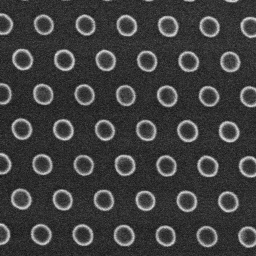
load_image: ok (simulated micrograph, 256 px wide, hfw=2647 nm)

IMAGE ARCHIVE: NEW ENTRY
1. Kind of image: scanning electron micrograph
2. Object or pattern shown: a regular array of raised bodies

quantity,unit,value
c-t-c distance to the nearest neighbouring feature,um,0.418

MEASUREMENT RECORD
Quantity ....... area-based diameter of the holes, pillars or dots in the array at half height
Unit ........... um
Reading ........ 0.206